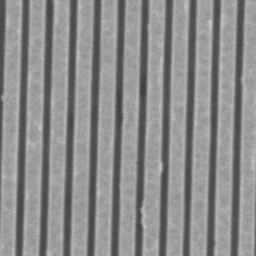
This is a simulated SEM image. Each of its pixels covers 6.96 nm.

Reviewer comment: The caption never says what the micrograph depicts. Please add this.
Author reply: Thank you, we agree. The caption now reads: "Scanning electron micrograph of parallel lines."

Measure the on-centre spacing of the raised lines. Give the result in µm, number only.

0.166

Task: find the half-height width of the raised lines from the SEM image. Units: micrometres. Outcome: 0.106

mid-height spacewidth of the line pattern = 58.2 nanometres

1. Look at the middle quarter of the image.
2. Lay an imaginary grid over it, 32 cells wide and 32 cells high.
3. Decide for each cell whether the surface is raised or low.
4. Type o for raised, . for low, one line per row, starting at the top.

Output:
o..oooo..oooo..oooo..oooo..oooo.
o..oooo..oooo..oooo..oooo..oooo.
o..oooo..oooo..oooo..ooo...oooo.
o..oooo..oooo..oooo..ooo...oooo.
o..oooo..oooo..oooo..ooo...oooo.
o..oooo..oooo..oooo..ooo...oooo.
o..ooo...oooo..oooo..ooo...ooo..
o..ooo...oooo..oooo..ooo...ooo..
o..ooo...oooo..oooo..ooo...ooo..
o..ooo...oooo..oooo..oooo..ooo..
o..ooo...ooo...oooo..ooo...ooo..
o..ooo...ooo...oooo..ooo...ooo..
o..ooo...ooo...oooo..ooo...ooo..
o..ooo...ooo...oooo..ooo...ooo..
o..ooo...oooo..ooo...ooo...ooo..
o..ooo...oooo..ooo...ooo...ooo..
o..ooo...oooo..ooo...ooo...ooo..
...ooo...oooo..ooo...ooo...ooo..
...ooo...ooo...ooo...ooo...ooo..
...ooo...ooo...ooo..oooo...ooo..
...ooo...ooo...ooo..oooo...ooo..
...ooo...ooo...ooo..oooo...ooo..
..oooo...ooo..oooo..oooo...ooo..
..oooo...ooo..oooo..oooo..oooo..
..oooo...ooo..oooo..oooo..oooo..
..oooo...ooo..oooo..oooo..oooo..
..oooo..oooo..oooo..oooo..oooo..
..oooo..oooo..oooo..oooo..oooo..
..oooo..oooo..oooo..oooo..oooo..
..oooo..oooo..oooo..oooo..oooo..
..oooo..oooo..oooo..oooo..oooo..
..oooo..oooo..oooo..oooo..oooo..